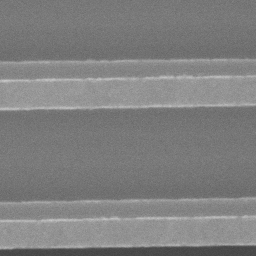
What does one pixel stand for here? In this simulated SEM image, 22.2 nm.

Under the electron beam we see lines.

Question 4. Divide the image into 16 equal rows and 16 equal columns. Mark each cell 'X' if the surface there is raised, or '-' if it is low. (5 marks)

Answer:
----------------
----------------
----------------
----------------
XXXXXXXXXXXXXXXX
XXXXXXXXXXXXXXXX
XXXXXXXXXXXXXXXX
----------------
----------------
----------------
----------------
----------------
------------XXXX
XXXXXXXXXXXXXXXX
XXXXXXXXXXXXXXXX
X---------------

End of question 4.